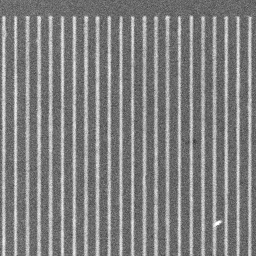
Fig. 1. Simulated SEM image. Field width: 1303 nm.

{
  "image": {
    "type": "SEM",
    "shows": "parallel lines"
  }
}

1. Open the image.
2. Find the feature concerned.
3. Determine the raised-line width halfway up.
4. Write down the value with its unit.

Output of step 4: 2.87 pixels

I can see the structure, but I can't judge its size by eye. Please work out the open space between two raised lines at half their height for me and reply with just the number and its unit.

48.4 nm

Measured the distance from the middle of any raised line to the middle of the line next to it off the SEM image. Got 59.7 nm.